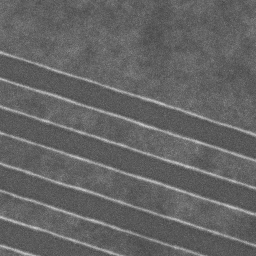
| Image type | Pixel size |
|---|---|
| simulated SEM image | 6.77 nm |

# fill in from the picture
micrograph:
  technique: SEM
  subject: parallel lines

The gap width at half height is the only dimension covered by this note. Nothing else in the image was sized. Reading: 165 nm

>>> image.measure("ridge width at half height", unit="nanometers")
185